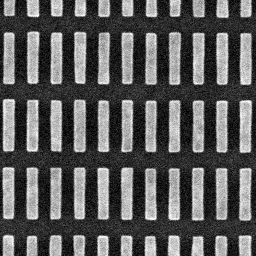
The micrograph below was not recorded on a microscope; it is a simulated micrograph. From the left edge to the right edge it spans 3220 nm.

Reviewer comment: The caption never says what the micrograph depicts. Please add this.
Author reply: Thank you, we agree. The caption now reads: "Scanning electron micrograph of groups of lines, slits or small figures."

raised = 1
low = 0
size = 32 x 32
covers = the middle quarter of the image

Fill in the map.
00011000011000011000111000111000
00011000011000011000111000111000
00011000011000011000111000111000
00011000011000011000111000111000
00011000011000011000111000111000
00000000000000000000000000000000
00000000000000000000000000000000
00000000000000000000000000000000
00000000000000000000000000000000
00011000011000011000011000111000
00011000011000011000111000111000
00011000011000011000111000111000
00011000011000011000111000111000
00011000011000011000111000111000
00011000011000011000111000111000
00011000011000011000111000111000
00011000011000011000111000111000
00011000011000011000111000111000
00011000011000011000111000111000
00011000011000011000111000111000
00011000011000011000111000111000
00011000011000011000011000111000
00000000000000000000000000000000
00000000000000000000000000000000
00000000000000000000000000000000
00000000000000000000000000000000
00011000011000011000111000111000
00011000011000011000111000111000
00011000011000011000111000111000
00011000011000011000111000111000
00011000011000011000111000111000
00011000011000011000111000111000